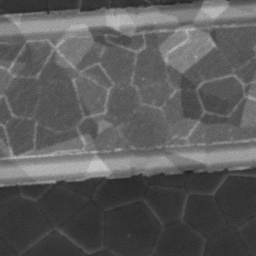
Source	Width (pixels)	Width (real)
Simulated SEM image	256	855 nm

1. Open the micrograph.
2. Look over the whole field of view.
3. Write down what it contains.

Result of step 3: one or a few lines or trenches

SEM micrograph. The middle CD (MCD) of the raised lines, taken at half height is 474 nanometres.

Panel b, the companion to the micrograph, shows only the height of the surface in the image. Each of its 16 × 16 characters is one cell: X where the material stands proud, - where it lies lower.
----------------
-----XXXXXXXXXXX
XXXXXXXXXXXXXXXX
XXXXXXXXXXXXXXXX
XXXXXXXXXXXXXXXX
XXXXXXXXXXXXXXXX
XXXXXXXXXXXXXXXX
XXXXXXXXXXXXXXXX
XXXXXXXXXXXXXXXX
XXXXXXXXXXXXXXXX
XXX-------------
----------------
----------------
----------------
----------------
----------------